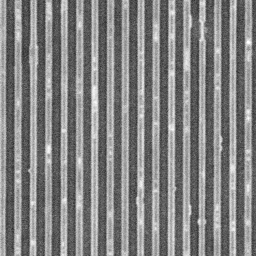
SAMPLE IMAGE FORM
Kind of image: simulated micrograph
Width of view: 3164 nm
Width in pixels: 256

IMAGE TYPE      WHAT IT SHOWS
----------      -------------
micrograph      parallel lines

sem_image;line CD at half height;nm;72.6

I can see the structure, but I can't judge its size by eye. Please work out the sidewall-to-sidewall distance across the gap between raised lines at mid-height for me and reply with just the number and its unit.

0.122 um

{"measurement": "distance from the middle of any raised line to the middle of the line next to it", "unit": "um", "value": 0.19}